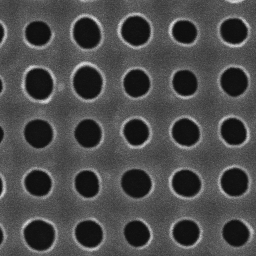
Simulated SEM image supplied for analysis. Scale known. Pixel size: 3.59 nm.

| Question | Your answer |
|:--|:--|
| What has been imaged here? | a regular array of holes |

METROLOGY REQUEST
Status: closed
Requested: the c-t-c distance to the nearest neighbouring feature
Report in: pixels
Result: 48.6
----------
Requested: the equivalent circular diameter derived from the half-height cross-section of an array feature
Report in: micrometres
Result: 0.0976